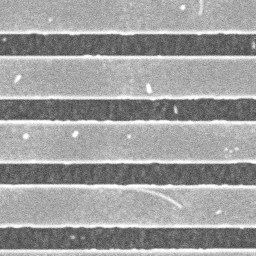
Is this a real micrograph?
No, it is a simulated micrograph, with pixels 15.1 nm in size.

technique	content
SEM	lines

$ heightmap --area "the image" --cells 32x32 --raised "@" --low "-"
@@@@@@@@@@@@@@@@@@@@@@@@@@@@@@@@
@@@@@@@@@@@@@@@@@@@@@@@@@@@@@@@@
@@@@@@@@@@@@@@@@@@@@@@@@@@@@@@@@
@@@@@@@@@@@@@@@@@@@@@@@@@@@@@@@@
--------------------------------
--------------------------------
--------------------------------
@@@@@@@@@@@@@@@@@@@@@@@@@@@@@@@@
@@@@@@@@@@@@@@@@@@@@@@@@@@@@@@@@
@@@@@@@@@@@@@@@@@@@@@@@@@@@@@@@@
@@@@@@@@@@@@@@@@@@@@@@@@@@@@@@@@
@@@@@@@@@@@@@@@@@@@@@@@@@@@@@@@@
--------------------------------
--------------------------------
--------------------------------
@@@@@@@@@@@@@@@@@@@@@@@@@@@@@@@@
@@@@@@@@@@@@@@@@@@@@@@@@@@@@@@@@
@@@@@@@@@@@@@@@@@@@@@@@@@@@@@@@@
@@@@@@@@@@@@@@@@@@@@@@@@@@@@@@@@
@@@@@@@@@@@@@@@@@@@@@@@@@@@@@@@@
--------------------------------
--------------------------------
--------------------------------
@@@@@@@@@@@@@@@@@@@@@@@@@@@@@@@@
@@@@@@@@@@@@@@@@@@@@@@@@@@@@@@@@
@@@@@@@@@@@@@@@@@@@@@@@@@@@@@@@@
@@@@@@@@@@@@@@@@@@@@@@@@@@@@@@@@
@@@@@@@@@@@@@@@@@@@@@@@@@@@@@@@@
--------------------------------
--------------------------------
--------------------------------
@@@@@@@@@@@@@@@@@@@@@@@@@@@@@@@@